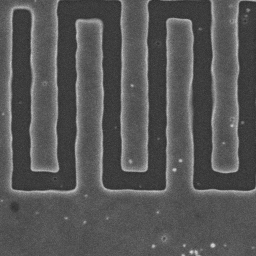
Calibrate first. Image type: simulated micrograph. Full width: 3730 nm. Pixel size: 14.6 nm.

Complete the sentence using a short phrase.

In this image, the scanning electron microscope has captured groups of lines, slits or small figures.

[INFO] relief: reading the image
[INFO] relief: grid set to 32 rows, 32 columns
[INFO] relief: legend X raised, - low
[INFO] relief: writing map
XXXXXXX--------XXXX-------XXXX--
XX--XXX--------XXXX-------XXXX--
X---XXX--------XXXX--XX----XXX--
XX--XXX---XXX--XXX---XXX--XXXX--
XX--XXX---XXX--XXX---XXX--XXXX--
X---XXX---XXX--XXX---XXX--XXXX--
X---XXX---XXX--XXX---XXX---XXX--
X---XXX---XXX--XXX---XXX---XXX--
X---XXX---XXX--XXX---XXX--XXXX--
X---XXX---XXX--XXX---XXX---XXX--
X---XXX---XXX--XXX---XXX---XXX--
X---XXX---XXX--XXX---XXX---XXX--
X---XXX---XXX--XXXX--XXX---XXX--
X---XXX---XXX--XXXX--XXX---XXX--
X---XXX---XXX--XXXX--XXX---XXX--
X---XXX---XXX--XXXX--XXX--XXXX--
X---XXX---XXX--XXX---XXX---XXX--
X---XXX---XXX--XXX---XXX---XXX--
X---XXX---XXX--XXX---XXX---XXX--
XX--XXX---XXX--XXX---XXX--XXXX--
XX--XXX---XXX--XXX---XXX--XXXX--
XX--------XXX--------XXX----X---
X---------XXX--------XXX--------
XX-------XXXX--------XXX--------
XXXXXXXXXXXXXXXXXXXXXXXXXXXXXXXX
XXXXXXXXXXXXXXXXXXXXXXXXXXXXXXXX
XXXXXXXXXXXXXXXXXXXXXXXXXXXXXXXX
XXXXXXXXXXXXXXXXXXXXXXXXXXXXXXXX
XXXXXXXXXXXXXXXXXXXXXXXXXXXXXXXX
XXXXXXXXXXXXXXXXXXXXXXXXXXXXXXXX
XXXXXXXXXXXXXXXXXXXXXXXXXXXXXXXX
XXXXXXXXXXXXXXXXXXXXXXXXXXXXXXXX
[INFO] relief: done